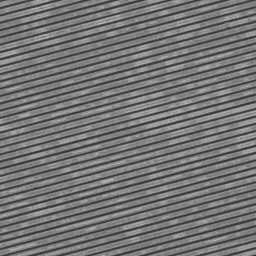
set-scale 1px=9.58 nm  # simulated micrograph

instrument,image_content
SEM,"parallel lines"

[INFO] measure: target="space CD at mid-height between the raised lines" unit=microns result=0.0243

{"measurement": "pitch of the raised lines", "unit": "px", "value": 7.07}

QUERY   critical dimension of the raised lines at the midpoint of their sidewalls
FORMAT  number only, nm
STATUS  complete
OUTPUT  48.6